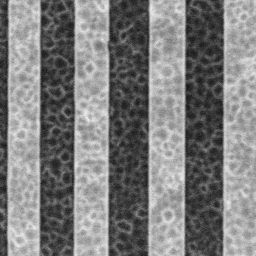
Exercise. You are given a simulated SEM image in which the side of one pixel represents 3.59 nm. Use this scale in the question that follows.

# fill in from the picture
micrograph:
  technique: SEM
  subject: one or a few lines or trenches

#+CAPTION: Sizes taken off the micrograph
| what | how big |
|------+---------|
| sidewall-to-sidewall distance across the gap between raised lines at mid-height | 0.143 micrometres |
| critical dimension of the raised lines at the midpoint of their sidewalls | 118 nm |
